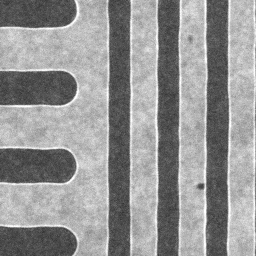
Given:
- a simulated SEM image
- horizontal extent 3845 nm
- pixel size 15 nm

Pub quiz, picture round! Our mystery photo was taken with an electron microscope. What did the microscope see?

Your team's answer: groups of lines, slits or small figures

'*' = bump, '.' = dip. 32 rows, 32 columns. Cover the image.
..........***...****...***...***
..........***...****...***...***
.........*****..****...***...***
****...*******..****..****...***
**************..****..****...***
**************..****..****...***
**************..****..****...***
**************..****..****...***
**************..****..****...***
.........*****..****..****...***
..........****..****..****...***
..........***...****..****...***
.........****...****..****...***
*************...****..****...***
*************...****..****...***
**************..****..****...***
**************..****..****...***
*************...****..****...***
*..**********...****..****...***
.........****...****..****...***
..........***...****..****...***
.........****...****..****...***
.........****...****..****...***
**************..****..****...***
**************..****..****...***
*************...****..****...***
*************...****..****...***
*************...****..****...***
........*****...****..****...***
.........*****..****..****..****
..........***...****..****..****
.........****...****..****..****